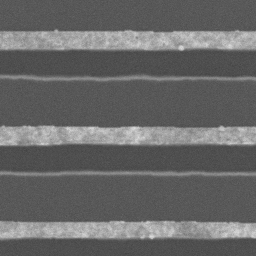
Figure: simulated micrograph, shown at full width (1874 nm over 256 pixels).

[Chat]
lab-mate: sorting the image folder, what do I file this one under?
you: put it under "lines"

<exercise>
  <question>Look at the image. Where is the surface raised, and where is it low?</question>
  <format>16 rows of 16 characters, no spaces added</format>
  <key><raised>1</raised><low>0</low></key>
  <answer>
1111111111111111
1111111111111111
1111111111111111
0000000000000000
0000000000000000
1111111111111111
1111111111111111
1111111111111111
1111111111111111
0000000000000000
0000000000000000
1111111111111111
1111111111111111
1111111111111111
1111111111111111
0000000000000000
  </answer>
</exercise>